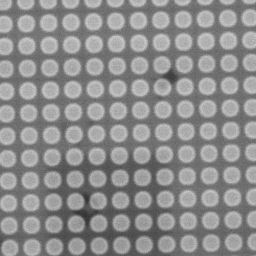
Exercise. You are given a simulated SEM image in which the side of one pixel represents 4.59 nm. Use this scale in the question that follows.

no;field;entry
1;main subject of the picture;an array of small figures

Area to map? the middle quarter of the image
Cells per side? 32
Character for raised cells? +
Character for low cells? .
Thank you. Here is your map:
++++..++++.++++..++++..+++..++++
++++..+++...+++..+++...+++...+++
.++....++.......................
................................
.......++...+++...++...+++...+++
++++..++++..+++..++++..++++.++++
++++..++++..+++..++++..+++..++++
.+++..+++...+++...++....++...++.
................................
..............................+.
.++....++...+++..++++..++++..+++
++++..++++..++++.++++..++++..+++
++++..++++..+++..++++..+++...+++
.+++...++....++....+............
................................
.............+....++....++...+++
.+++..++++..+++..++++..++++..+++
.+++..++++..++++.++++..++++..+++
.+++..++++..+++...+++...++...+++
..+.............................
................................
..++...++....++...+++..++++..+++
.++++.++++..++++..+++..++++..+++
.++++.++++..++++..+++..++++..+++
.+++...+++...++....++....+......
................................
........................++....++
.+++...+++..++++..+++..++++..+++
.++++.++++..++++..++++.++++..+++
.++++..+++..++++..+++...+++..+++
..++...++.......................
................................